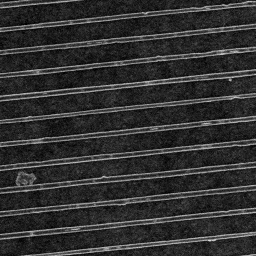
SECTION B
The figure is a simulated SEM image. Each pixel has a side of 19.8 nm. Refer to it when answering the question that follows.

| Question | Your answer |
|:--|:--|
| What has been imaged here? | parallel lines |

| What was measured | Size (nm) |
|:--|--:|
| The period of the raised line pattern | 454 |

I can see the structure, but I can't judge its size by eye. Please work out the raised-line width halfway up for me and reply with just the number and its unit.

0.0911 micrometres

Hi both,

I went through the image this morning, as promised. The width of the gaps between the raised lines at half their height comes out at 18.2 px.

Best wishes